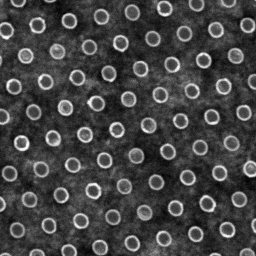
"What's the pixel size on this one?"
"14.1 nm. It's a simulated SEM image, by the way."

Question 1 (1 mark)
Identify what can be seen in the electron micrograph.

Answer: a regular array of raised bodies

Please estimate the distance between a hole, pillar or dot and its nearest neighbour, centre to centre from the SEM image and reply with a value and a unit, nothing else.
449 nanometres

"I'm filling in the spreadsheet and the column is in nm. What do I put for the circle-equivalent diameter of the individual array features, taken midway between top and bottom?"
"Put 207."